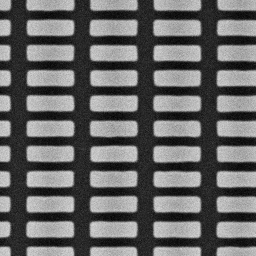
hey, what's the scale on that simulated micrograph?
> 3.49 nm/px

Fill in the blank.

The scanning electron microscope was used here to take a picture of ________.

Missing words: groups of lines, slits or small figures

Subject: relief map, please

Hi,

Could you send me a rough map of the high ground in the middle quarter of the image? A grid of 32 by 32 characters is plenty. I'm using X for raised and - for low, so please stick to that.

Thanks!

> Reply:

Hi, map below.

--------------------------------
--------------------------------
XX-----XXXXXXXXXXX-----XXXXXXXXX
XX-----XXXXXXXXXXX-----XXXXXXXXX
XX-----XXXXXXXXXXX-----XXXXXXXXX
----------------------------XXX-
--------------------------------
--------------------------------
XX-----XXXXXXXXXXX-----XXXXXXXXX
XX-----XXXXXXXXXXX-----XXXXXXXXX
XX-----XXXXXXXXXXX-----XXXXXXXXX
XX-----XXXXXXXXXXX-----XXXXXXXXX
--------------------------------
--------------------------------
XX-----X--XXXXXXXX-----XXXXXXXXX
XX-----XXXXXXXXXXX-----XXXXXXXXX
XX-----XXXXXXXXXXX-----XXXXXXXXX
XX-----XXXXXXXXXXX-----XXXXXXXXX
--------------------------------
--------------------------------
--------------------------------
XX-----XXXXXXXXXXX-----XXXXXXXXX
XX-----XXXXXXXXXXX-----XXXXXXXXX
XX-----XXXXXXXXXXX-----XXXXXXXXX
-----------------------XXXX-----
--------------------------------
--------------------------------
XX-----XXXXXXXXXXX-----XXXXXXXXX
XX-----XXXXXXXXXXX-----XXXXXXXXX
XX-----XXXXXXXXXXX-----XXXXXXXXX
XX-----XXXXXXXXXXX-----XXXXXXXXX
--------------------------------